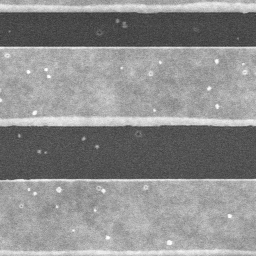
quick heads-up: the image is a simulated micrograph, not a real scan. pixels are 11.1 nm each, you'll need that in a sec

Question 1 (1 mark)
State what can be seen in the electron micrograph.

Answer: lines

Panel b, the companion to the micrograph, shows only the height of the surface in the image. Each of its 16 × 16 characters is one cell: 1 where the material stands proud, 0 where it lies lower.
1111111111111111
0000000000000000
0000000000000000
1111111111111111
1111111111111111
1111111111111111
1111111111111111
1111111111111111
0000000000000000
0000000000000000
0000000000000000
1111111111111111
1111111111111111
1111111111111111
1111111111111111
1111111111111111